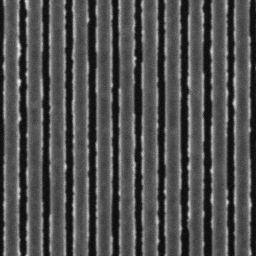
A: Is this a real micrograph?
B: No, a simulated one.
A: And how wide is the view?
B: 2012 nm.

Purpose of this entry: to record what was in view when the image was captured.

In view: parallel lines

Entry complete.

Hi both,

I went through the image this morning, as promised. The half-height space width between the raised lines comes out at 7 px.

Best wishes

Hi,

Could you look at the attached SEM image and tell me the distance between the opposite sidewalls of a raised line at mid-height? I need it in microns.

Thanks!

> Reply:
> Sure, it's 0.125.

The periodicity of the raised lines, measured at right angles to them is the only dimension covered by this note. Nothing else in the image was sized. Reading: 181 nm